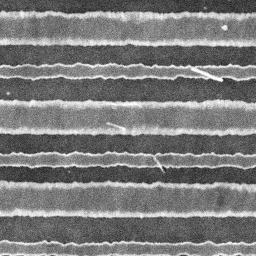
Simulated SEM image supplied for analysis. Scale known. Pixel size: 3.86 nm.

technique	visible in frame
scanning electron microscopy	lines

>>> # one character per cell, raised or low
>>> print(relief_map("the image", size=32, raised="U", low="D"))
DDDDDDDDDDDDDDDDDDDDDDDDDDDDDDDD
DDDDDDDDDDDDDDDDDDDDDDDDDDDDDDDD
UUUUUUUUUUUUUUUUUUUUUUUUUUUUUUUU
UUUUUUUUUUUUUUUUUUUUUUUUUUUUUUUU
UUUUUUUUUUUUUUUUUUUUUUUUUUUUUUUU
UDDDUDDDDUUUUUUUDUUUUUUUUUUUUUUU
DDDDDDDDDDDDDDDDDDDDDDDDDDDDDDDD
DDDDDDDDDDDDDDDDDDDDDDDDDDDDDDDD
UUUUUUUUUUUUUUUUUUUUUUUUUUUUUUUU
UUUUUUUUUUUUUUUUUUUUUUUUUUUUUUUU
DDDDDDDDDDDDDDDDDDDDDDDDDDDDDDDD
DDDDDDDDDDDDDDDDDDDDDDDDDDDDDDDD
DDDDDDDDDDDDDDDDDDDDDDDDDDDDDDDD
UUUUUUUUUUUUUUUUUUUUUUUUUUUUUUUU
UUUUUUUUUUUUUUUUUUUUUUUUUUUUUUUU
UUUUUUUUUUUUUUUUUUUUUUUUUUUUUUUU
UUUUUUUUUUUUUUUUUUUUUUUUUUUUUUUU
DDDDDDDDDDDDDDDDDDDDDDDDDDDDDDDD
DDDDDDDDDDDDDDDDDDDDDDDDDDDDDDDD
UUUUUUUUUUUUUUUUUUUUUUUUUUUUUUUU
UUUUUUUUUUUUUUUUUUUUUUUUUUUUUUUU
DDDDDDDDDDDDDDDDDDDDDDDDDDDDDDDD
DDDDDDDDDDDDDDDDDDDDDDDDDDDDDDDD
UUUUUUUUUUUUUUUUUUUUUUUUUUUUUUUU
UUUUUUUUUUUUUUUUUUUUUUUUUUUUUUUU
UUUUUUUUUUUUUUUUUUUUUUUUUUUUUUUU
UUUUUUUUUUUUUUUUUUUUUUUUUUUUUUUU
DDDDDDDDDDDDDDDDDDDDDDDDDDDDDDDD
DDDDDDDDDDDDDDDDDDDDDDDDDDDDDDDD
DDDDDDDDDDDDDDDDDDDDDDDDDDDDDDDD
UUUUUUUUUDUUUUUUUUUUUUUUUUUDUUUU
UUUUUUUUUUUUUUUUUUUUUUUUUUUUUUUU